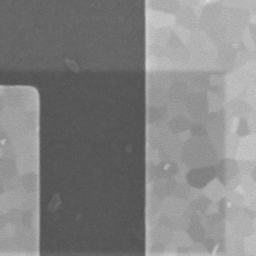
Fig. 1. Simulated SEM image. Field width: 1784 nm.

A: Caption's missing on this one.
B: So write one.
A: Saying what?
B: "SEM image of wiring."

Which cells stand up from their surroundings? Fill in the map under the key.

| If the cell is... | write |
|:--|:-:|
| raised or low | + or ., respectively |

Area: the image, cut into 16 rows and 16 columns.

.........+++++++
.........+++++++
.........+++++++
.........+++++++
.........+++++++
++.......+++++++
++.......+++++++
++.......+++++++
++.......+++++++
++.......+++++++
++.......+++++++
++.......+++++++
++.......+++++++
++.......+++++++
++.......+++++++
++.......+++++++